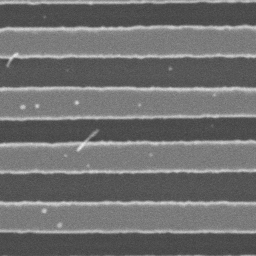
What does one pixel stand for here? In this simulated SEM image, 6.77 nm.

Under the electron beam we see lines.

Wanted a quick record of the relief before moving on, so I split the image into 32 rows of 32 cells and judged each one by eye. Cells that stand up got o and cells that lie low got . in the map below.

o..oo.o....o....................
................................
................................
oooooooooooooooooooooooooooooooo
oooooooooooooooooooooooooooooooo
oooooooooooooooooooooooooooooooo
oooooooooooooooooooooooooooooooo
................................
................................
................................
................................
oooooooooooooooooooooooooooooooo
oooooooooooooooooooooooooooooooo
oooooooooooooooooooooooooooooooo
oooooooooooooooooooooooooooooooo
................................
................................
................................
oooooooooooooooooooooooooooooooo
oooooooooooooooooooooooooooooooo
oooooooooooooooooooooooooooooooo
oooooooooooooooooooooooooooo....
................................
................................
................................
oooooooooooooooooooooooooooooooo
oooooooooooooooooooooooooooooooo
oooooooooooooooooooooooooooooooo
oooooooooooooooooooooooooooooooo
................................
................................
................................